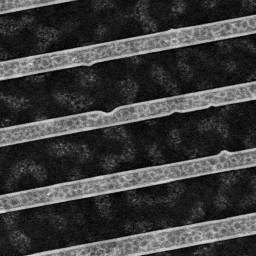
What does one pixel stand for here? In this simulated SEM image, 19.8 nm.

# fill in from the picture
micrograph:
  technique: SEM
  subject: one or a few lines or trenches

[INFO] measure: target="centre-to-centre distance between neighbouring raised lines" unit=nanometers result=1290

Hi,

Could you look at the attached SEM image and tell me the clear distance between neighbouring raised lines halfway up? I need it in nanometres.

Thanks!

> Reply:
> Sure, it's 971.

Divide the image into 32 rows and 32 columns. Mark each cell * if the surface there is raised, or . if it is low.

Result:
******..........................
................................
.............................***
........................********
..................************..
.............***********........
.......***********..............
..***********...................
*******.........................
***.............................
...............................*
..........................******
....................**********..
...............**********.......
.........***********............
....***********.................
*********.......................
****............................
................................
...........................*****
......................**********
................***********.....
...........***********..........
.....***********................
.**********.....................
*****...........................
................................
............................****
......................**********
.................*************..
............************........
......*************.............